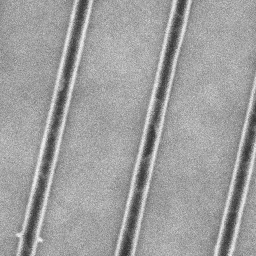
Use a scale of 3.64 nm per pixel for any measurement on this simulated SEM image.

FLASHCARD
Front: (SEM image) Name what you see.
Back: one or a few lines or trenches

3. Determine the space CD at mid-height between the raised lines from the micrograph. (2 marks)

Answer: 294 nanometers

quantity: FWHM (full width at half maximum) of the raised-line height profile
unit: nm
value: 58.2